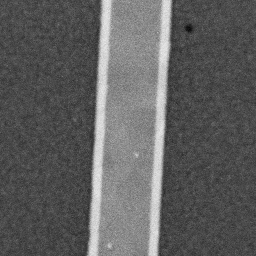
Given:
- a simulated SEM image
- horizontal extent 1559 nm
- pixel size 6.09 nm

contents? one or a few lines or trenches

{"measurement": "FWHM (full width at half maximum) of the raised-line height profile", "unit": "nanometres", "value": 366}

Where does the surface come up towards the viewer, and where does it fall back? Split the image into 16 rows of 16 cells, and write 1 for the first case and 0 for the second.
0000000111000000
0000000111000000
0000000111000000
0000001111000000
0000001111000000
0000001111000000
0000001111000000
0000001111000000
0000001111000000
0000001111000000
0000001111000000
0000001111000000
0000001111000000
0000001111000000
0000001111000000
0000001111000000